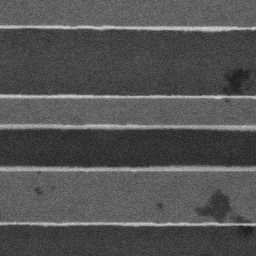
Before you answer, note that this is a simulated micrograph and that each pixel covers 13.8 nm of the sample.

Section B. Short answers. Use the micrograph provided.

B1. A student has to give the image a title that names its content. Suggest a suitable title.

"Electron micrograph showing lines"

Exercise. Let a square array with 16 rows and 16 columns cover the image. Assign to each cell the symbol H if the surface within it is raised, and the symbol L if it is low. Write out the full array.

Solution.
HHHHHHHHHHHHHHHH
HHHHHHHHHHHHHHHH
LLLLLLLLLLLLLLLL
LLLLLLLLLLLLLLLL
LLLLLLLLLLLLLLLL
LLLLLLLLLLLLLLLL
HHHHHHHHHHHHHHHH
HHHHHHHHHHHHHHHH
LLLLLLLLLLLLLLLL
LLLLLLLLLLLLLLLL
LLLLLLLLLLLLLLLL
HHHHHHHHHHHHHHHH
HHHHHHHHHHHHHHHH
HHHHHHHHHHHHHHHH
LLLLLLLLLLLLLLLL
LLLLLLLLLLLLLLLL